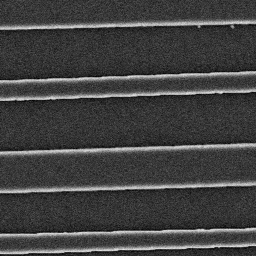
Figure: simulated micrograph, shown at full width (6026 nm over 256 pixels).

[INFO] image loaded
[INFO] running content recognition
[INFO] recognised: lines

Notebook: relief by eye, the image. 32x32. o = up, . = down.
oooooooooooooooooooooooooooooooo
oooooooooooooooooooooooooooooooo
oooooooooooooooooooooooooooooooo
oooooo..........................
................................
................................
................................
................................
................................
...................ooooooooooooo
oooooooooooooooooooooooooooooooo
oooooooooooooooooooooooooooooooo
................................
................................
................................
................................
................................
................................
.................ooooooooooooooo
oooooooooooooooooooooooooooooooo
oooooooooooooooooooooooooooooooo
oooooooooooooooooooooooooooooooo
oooooooooooooooooooooooooooooooo
ooooooooooooooooo...............
................................
................................
................................
................................
................................
oooooooooooooooooooooooooooooooo
oooooooooooooooooooooooooooooooo
oooooooo........................